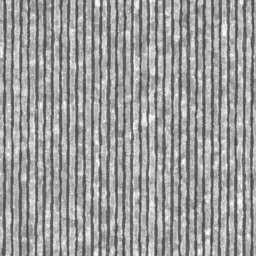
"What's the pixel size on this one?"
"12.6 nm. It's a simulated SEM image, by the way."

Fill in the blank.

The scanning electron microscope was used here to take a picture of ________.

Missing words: parallel lines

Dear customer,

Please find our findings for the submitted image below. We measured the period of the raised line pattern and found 100 nanometers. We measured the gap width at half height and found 42.5 nanometers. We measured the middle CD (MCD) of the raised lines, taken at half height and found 53.5 nm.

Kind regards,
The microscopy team